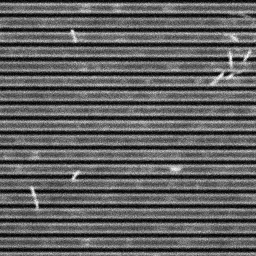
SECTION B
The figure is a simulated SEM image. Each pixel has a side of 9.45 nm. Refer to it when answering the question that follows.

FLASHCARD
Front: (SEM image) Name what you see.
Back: parallel lines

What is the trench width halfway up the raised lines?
6.13 px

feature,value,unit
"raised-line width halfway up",82.6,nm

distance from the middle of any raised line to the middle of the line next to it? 138 nanometers